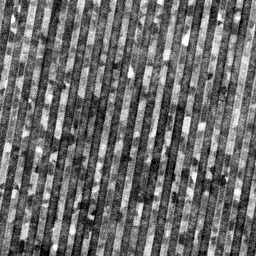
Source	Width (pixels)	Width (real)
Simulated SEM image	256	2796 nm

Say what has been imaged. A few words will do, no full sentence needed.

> parallel lines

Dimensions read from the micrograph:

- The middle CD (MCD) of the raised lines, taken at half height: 0.0726 microns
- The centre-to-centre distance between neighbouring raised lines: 170 nm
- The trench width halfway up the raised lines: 101 nm